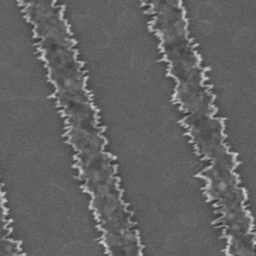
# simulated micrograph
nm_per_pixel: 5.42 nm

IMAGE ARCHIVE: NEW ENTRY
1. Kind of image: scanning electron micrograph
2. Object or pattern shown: one or a few lines or trenches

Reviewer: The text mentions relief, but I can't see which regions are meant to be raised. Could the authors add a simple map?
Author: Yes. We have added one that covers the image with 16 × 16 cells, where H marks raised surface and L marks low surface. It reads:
LHHHLLLLLHHLLLLL
LLHHLLLLLLHHLLLL
LLHHLLLLLLHHLLLL
LLLHHLLLLLHHLLLL
LLLHHLLLLLLHHLLL
LLLHHLLLLLLHHLLL
LLLLHHLLLLLHHLLL
LLLLHHLLLLLLHHLL
LLLLHHLLLLLLHHLL
LLLLLHHLLLLLHHLL
LLLLLHHLLLLLLHHL
LLLLLHHLLLLLLHHL
LLLLLLHHLLLLLHHL
LLLLLLHHLLLLLLHH
HLLLLLHHHLLLLLHH
HLLLLLLHHLLLLLHH